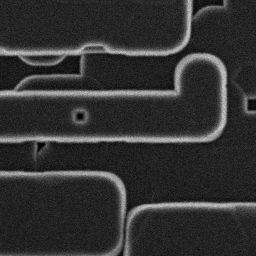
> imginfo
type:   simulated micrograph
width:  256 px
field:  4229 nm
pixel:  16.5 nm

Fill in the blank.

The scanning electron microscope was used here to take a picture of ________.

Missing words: wiring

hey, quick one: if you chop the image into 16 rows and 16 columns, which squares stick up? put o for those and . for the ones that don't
oooooooooooo....
oooooooooooo....
oooooooooooo....
................
...........ooo..
...........ooo..
oooooooooooooo..
oooooooooooooo..
ooooooooooooo...
................
................
ooooooo.........
oooooooo........
oooooooooooooooo
oooooooooooooooo
oooooooooooooooo